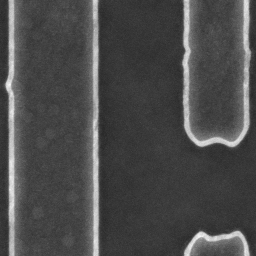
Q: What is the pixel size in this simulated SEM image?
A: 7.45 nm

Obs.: one or a few lines or trenches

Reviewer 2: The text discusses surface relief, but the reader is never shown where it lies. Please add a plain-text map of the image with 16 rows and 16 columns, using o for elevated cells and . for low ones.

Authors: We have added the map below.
.ooooo......ooo.
.ooooo......ooo.
.ooooo......ooo.
.ooooo......oooo
.ooooo......ooo.
.ooooo......ooo.
.ooooo......ooo.
.ooooo......ooo.
.ooooo......ooo.
.ooooo..........
.ooooo..........
.ooooo..........
.ooooo..........
.ooooo..........
.ooooo..........
.ooooo......ooo.